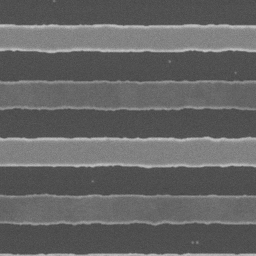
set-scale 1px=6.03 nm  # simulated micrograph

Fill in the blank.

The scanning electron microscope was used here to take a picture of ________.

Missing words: lines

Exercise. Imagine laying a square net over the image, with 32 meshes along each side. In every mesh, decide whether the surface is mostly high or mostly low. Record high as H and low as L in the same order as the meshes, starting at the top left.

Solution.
LLLLLLLLLLLLLLLLLLLLLLLLLLLLLLLL
LLLLLLLLLLLLLLLLLLLLLLLLLLLLLLLL
LLLLLLLLLLLLLLLLLLLLLLLLLLLLLLLL
HHHHHHHHHHHHHHHHHHHHHHHHHHHHHHHH
HHHHHHHHHHHHHHHHHHHHHHHHHHHHHHHH
HHHHHHHHHHHHHHHHHHHHHHHHHHHHHHHH
LLLLLLHLLLLLLLLLLLLLLLLLLLLLLLLL
LLLLLLLLLLLLLLLLLLLLLLLLLLLLLLLL
LLLLLLLLLLLLLLLLLLLLLLLLLLLLLLLL
LLLLLLLLLLLLLLLLLLLLLLLLLLLLLLLL
HHHHHHHHHHHHHHHHHHHHHHHHHHHHHHHH
HHHHHHHHHHHHHHHHHHHHHHHHHHHHHHHH
HHHHHHHHHHHHHHHHHHHHHHHHHHHHHHHH
HLLHHHHLLLLHHHHHHHHHHHHLLLLLLLHH
LLLLLLLLLLLLLLLLLLLLLLLLLLLLLLLL
LLLLLLLLLLLLLLLLLLLLLLLLLLLLLLLL
LLLLLLLLLLLLLLLLLLLLLLLLLLLLLLLL
HHHHHHHHHHHHHHHHHHHHHHHHHHHHHHHH
HHHHHHHHHHHHHHHHHHHHHHHHHHHHHHHH
HHHHHHHHHHHHHHHHHHHHHHHHHHHHHHHH
HHHHHHHHHHHHHHHHHHHHHHHHHHHHHHHH
LLLLLLLLLLLLLLLLLLLLLLLLLLLLLLLL
LLLLLLLLLLLLLLLLLLLLLLLLLLLLLLLL
LLLLLLLLLLLLLLLLLLLLLLLLLLLLLLLL
LLLLHHHLLLLLLLHHHLLLLLLLLLLLLLLL
HHHHHHHHHHHHHHHHHHHHHHHHHHHHHHHH
HHHHHHHHHHHHHHHHHHHHHHHHHHHHHHHH
HHHHHHHHHHHHHHHHHHHHHHHHHHHHHHHH
LLLLLLLLLLLLLLLLLLLLLLLLLLLLLLLL
LLLLLLLLLLLLLLLLLLLLLLLLLLLLLLLL
LLLLLLLLLLLLLLLLLLLLLLLLLLLLLLLL
LLLLLLLLLLLLLLLLLLLLLLLLLLLLLLLL